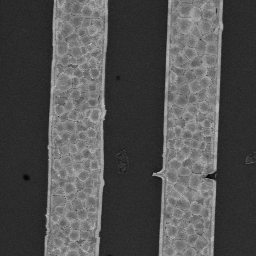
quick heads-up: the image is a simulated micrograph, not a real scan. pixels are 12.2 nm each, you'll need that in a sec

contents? one or a few lines or trenches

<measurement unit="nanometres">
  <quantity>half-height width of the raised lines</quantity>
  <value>619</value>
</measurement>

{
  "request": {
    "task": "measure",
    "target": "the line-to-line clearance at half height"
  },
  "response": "765 nanometres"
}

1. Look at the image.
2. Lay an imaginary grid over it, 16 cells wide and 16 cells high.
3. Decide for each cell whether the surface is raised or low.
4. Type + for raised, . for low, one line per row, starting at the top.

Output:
...++++....+++..
...++++....+++..
...++++....+++..
...++++...++++..
...+++.....+++..
...+++....++++..
...+++....++++..
...+++....++++..
...+++....+++...
...+++....+++...
...+++....+++...
...+++....+++...
...+++....+++...
...+++....+++...
...+++....+++...
...+++....+++...